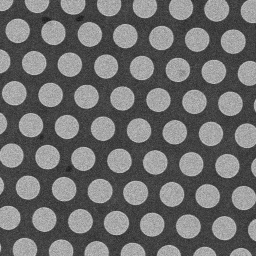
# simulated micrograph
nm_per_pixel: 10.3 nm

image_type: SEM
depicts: an array of small figures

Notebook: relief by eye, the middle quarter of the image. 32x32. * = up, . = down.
****....*****....*****....*****.
****....*****....*****....*****.
***.....*****....*****....*****.
..........*.......***.....*****.
................................
....***.........................
...*****....*****.....***.......
...*****....*****....*****....**
...******...*****....*****....**
...*****....*****....*****....**
....***.....*****....*****....**
..............*.......***.....**
................................
***.....***.....................
***....*****.....****.....***...
****...******...*****....*****..
****...******...******...******.
***....*****....******...******.
**......****....*****....*****..
..........................***...
................................
...****......**.................
..*****....*****.....****.....**
..******...******...******...***
..******...******...******...***
...****....******...******...***
....**......****....*****....***
.......................*......**
*...............................
**.....****......**.............
***...******...*****.....****...
***...******...******...******..